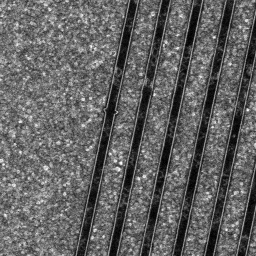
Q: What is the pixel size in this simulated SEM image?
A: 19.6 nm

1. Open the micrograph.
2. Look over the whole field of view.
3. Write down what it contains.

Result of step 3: parallel lines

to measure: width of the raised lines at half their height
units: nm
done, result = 175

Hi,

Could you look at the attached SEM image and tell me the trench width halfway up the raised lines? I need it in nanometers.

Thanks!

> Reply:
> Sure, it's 434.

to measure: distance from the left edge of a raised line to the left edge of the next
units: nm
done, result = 617